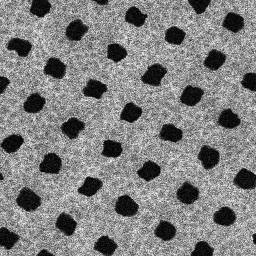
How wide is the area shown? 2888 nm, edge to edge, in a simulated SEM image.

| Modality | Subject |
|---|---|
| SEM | a regular array of holes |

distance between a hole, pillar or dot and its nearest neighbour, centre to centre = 42.1 pixels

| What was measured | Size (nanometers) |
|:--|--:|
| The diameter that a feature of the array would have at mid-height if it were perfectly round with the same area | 219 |